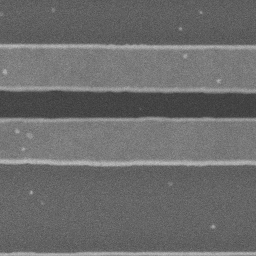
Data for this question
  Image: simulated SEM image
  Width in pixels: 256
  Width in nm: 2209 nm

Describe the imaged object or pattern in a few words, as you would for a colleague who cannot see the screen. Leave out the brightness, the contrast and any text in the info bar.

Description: lines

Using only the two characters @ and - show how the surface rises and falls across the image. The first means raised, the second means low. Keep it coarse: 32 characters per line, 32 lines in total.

--------------------------------
--------------------------------
--------------------------------
--------------------------------
--------------------------------
--------------------------------
@@@@@@@@@@@@@@@@@@@@@@@@@@@@@@@@
@@@@@@@@@@@@@@@@@@@@@@@@@@@@@@@@
@@@@@@@@@@@@@@@@@@@@@@@@@@@@@@@@
@@@@@@@@@@@@@@@@@@@@@@@@@@@@@@@@
@@@@@@@@@@@@@@@@@@@@@@@@@@@@@@@@
------------------------------@@
--------------------------------
--------------------------------
--------------------------------
@@@@@@@@@@@@@@@@@@@@@@@@@@@@@@@@
@@@@@@@@@@@@@@@@@@@@@@@@@@@@@@@@
@@@@@@@@@@@@@@@@@@@@@@@@@@@@@@@@
@@@@@@@@@@@@@@@@@@@@@@@@@@@@@@@@
@@@@@@@@@@@@@@@@@@@@@@@@@@@@@@@@
-------@@@@@@@@@@@--@@@@@@@@@@-@
--------------------------------
--------------------------------
--------------------------------
--------------------------------
--------------------------------
--------------------------------
--------------------------------
--------------------------------
--------------------------------
--------------------------------
--------------------------------